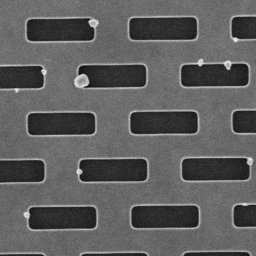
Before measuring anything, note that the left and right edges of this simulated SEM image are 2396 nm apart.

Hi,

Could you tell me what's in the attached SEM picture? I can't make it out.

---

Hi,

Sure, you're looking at groups of lines, slits or small figures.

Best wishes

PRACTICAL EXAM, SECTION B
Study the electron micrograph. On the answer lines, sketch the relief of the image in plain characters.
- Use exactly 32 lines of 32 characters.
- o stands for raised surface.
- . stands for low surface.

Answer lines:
oooooooooooooooooooooooooooooooo
oooooooooooooooooooooooooooooooo
oooo.......ooooo........ooooo...
ooo.........oooo.........oooo...
ooo.........oooo.........oooo...
oooooooooooooooooooooooooooooooo
oooooooooooooooooooooooooooooooo
oooooooooooooooooooooooooooooooo
.....ooooo........ooooo........o
.....oooooo.......ooooo........o
.....oooooo.......ooooo........o
oooooooooooooooooooooooooooooooo
oooooooooooooooooooooooooooooooo
oooooooooooooooooooooooooooooooo
oooo........oooo.........oooo...
ooo.........oooo.........oooo...
oooo........ooooo.......oooooo..
oooooooooooooooooooooooooooooooo
oooooooooooooooooooooooooooooooo
oooooooooooooooooooooooooooooooo
.....ooooo........ooooo........o
......oooo........ooooo........o
.....ooooo........ooooo........o
oooooooooooooooooooooooooooooooo
oooooooooooooooooooooooooooooooo
oooooooooooooooooooooooooooooooo
oooo........oooo.........oooo...
oooo........oooo.........oooo...
oooo........ooooo.......oooooooo
oooooooooooooooooooooooooooooooo
oooooooooooooooooooooooooooooooo
ooooooooooooooooooooooooooo...oo